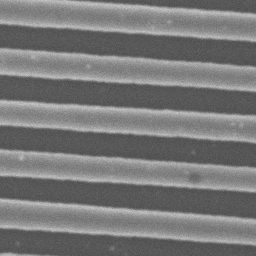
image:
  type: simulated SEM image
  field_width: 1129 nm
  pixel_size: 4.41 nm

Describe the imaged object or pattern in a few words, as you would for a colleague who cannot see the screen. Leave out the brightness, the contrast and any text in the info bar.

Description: lines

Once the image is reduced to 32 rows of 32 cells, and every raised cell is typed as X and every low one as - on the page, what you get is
XXXXXXXXXXXXXX------------------
XXXXXXXXXXXXXXXXXXXXXXXXXXXXX---
XXXXXXXXXXXXXXXXXXXXXXXXXXXXXXXX
---------XXXXXXXXXXXXXXXXXXXXXXX
----------------------XXXXXXXXXX
--------------------------------
XXXXXX--------------------------
XXXXXXXXXXXXXXXXXXX-------------
XXXXXXXXXXXXXXXXXXXXXXXXXXXXXXXX
----XXXXXXXXXXXXXXXXXXXXXXXXXXXX
------------------XXXXXXXXXXXXXX
--------------------------------
--------------------------------
XXXXXXXXXXXXXXX-----------------
XXXXXXXXXXXXXXXXXXXXXXXXXXXXXXXX
XXXXXXXXXXXXXXXXXXXXXXXXXXXXXXXX
-------------XXXXXXXXXXXXXXXXXXX
---------------------------XXXXX
--------------------------------
XXXXXXXXXX----------------------
XXXXXXXXXXXXXXXXXXXXXXXXX-------
XXXXXXXXXXXXXXXXXXXXXXXXXXXXXXXX
----------XXXXXXXXXXXXXXXXXXXXXX
------------------------XXXXXXXX
--------------------------------
XXXXXXXX------------------------
XXXXXXXXXXXXXXXXXXXX------------
XXXXXXXXXXXXXXXXXXXXXXXXXXXXXXXX
--XXXXXXXXXXXXXXXXXXXXXXXXXXXXXX
----------------XXXXXXXXXXXXXXXX
------------------------------XX
--------------------------------